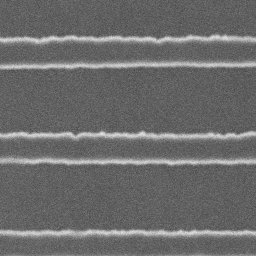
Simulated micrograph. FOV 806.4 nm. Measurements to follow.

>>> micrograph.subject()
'lines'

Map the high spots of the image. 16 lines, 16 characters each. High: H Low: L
LLLLLLLLLLLLLLLL
LLLLLLLLLLLLLLLL
HHHHHHHHHHHHHHHH
HHHHHHHHHHHHHHHH
LLLLLLLLLLLLLLLL
LLLLLLLLLLLLLLLL
LLLLLLLLLLLLLLLL
LLLLLLLLLLLLLLLL
HHHHHHHHHHHHHHHH
HHHHHHHHHHHHHHHH
LLLLLLLLLLLLLLLL
LLLLLLLLLLLLLLLL
LLLLLLLLLLLLLLLL
LLLLLLLLLLLLLLLL
HLLHHHHHHHLLHHHH
HHHHHHHHHHHHHHHH